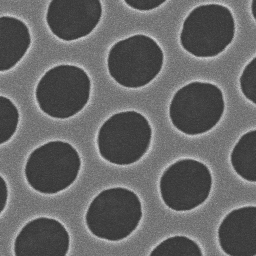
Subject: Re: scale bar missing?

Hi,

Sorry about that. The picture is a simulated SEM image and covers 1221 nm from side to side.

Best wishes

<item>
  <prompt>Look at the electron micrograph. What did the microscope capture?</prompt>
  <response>a regular array of holes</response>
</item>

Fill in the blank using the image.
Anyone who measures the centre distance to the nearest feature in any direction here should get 366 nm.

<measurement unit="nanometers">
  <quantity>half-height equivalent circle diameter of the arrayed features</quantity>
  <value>257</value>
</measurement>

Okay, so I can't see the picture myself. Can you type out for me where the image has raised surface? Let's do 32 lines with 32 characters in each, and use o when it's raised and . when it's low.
oooooo.......ooo....ooooooooooo.
oooooo.......ooooooooooo.....oo.
..oooo......ooooooooooo......ooo
...ooo......ooooooooooo......ooo
....ooo....oooooo.ooooo......ooo
....oooooooooo......ooo......ooo
...ooooooooooo......oooo....oooo
..ooooooooooo.......oooooooooooo
.oooooo...ooo.......ooooooooooo.
ooooo......ooo.....ooooooooooo..
ooooo......oooo...oooooo..oooo..
ooooo......ooooooooooo......oo..
.oooo......oooooooooo.......ooo.
..ooo.....ooooooooooo.......oooo
..oooo...ooooo....ooo.......oooo
..ooooooooooo......ooo.....ooooo
..oooooooooo.......oooo...ooooo.
.ooooooooooo.......ooooooooooo..
ooooo....ooo......ooooooooooo...
oooo......ooo.....ooooooooooo...
ooo.......oooo..oooooo...oooo...
ooo.......ooooooooooo.....oooo..
ooo......ooooooooooo......ooooo.
.ooo....oooooo.ooooo......oooooo
.ooooooooooo.....ooo......oooooo
.oooooooooo.......ooo....ooooooo
ooooooooooo.......ooooooooooo...
oooo...oooo.......oooooooooo....
ooo.....ooo......oooooooooo.....
oo.......ooo....oooooo.oooo.....
oo.......ooooooooooo.....oo.....
oo......ooooooooooo......ooo....